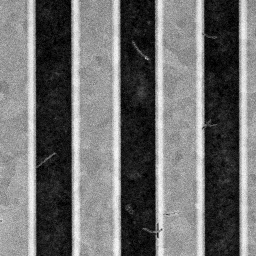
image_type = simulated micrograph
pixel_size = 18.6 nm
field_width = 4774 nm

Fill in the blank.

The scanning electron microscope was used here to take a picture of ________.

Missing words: one or a few lines or trenches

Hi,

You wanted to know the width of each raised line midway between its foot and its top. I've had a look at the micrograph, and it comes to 748 nanometres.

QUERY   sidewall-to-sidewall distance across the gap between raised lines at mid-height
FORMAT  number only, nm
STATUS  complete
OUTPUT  816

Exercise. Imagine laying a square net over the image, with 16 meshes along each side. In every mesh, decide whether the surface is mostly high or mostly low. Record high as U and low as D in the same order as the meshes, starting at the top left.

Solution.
UUDDDUUDDDUUDDDU
UUDDDUUDDDUUDDDU
UUDDDUUDDDUUDDDU
UUDDDUUDDDUUDDDU
UUDDDUUDDDUUDDDU
UUDDDUUDDDUUDDDU
UUDDDUUDDDUUDDDU
UUDDDUUDDDUUDDDU
UUDDDUUDDDUUDDDU
UUDDDUUDDDUUDDDU
UUDDDUUDDDUUDDDU
UUDDDUUDDDUUDDDU
UUDDDUUDDDUUDDDU
UUDDDUUDDDUUDDDU
UUDDDUUDDDUUDDDU
UUDDDUUDDDUUDDDU